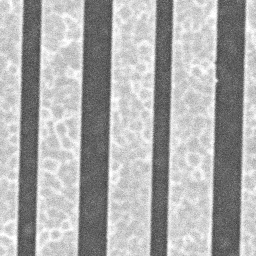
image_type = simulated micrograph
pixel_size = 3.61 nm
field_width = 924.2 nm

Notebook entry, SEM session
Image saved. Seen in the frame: one or a few lines or trenches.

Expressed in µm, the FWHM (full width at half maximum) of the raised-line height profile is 0.153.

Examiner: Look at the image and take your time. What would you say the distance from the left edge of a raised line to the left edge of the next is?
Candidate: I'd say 0.239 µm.